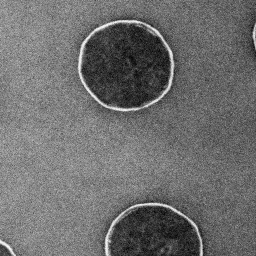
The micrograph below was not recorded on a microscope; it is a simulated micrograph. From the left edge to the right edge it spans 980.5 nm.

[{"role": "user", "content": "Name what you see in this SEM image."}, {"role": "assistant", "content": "raised bodies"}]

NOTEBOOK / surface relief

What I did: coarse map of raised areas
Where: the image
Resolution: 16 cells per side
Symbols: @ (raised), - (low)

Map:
----------------
-------@@-------
-----@@@@@------
-----@@@@@@-----
-----@@@@@@-----
-----@@@@@@-----
------@@@-------
----------------
----------------
----------------
----------------
----------------
----------------
-------@@@@@----
-------@@@@@----
@------@@@@@@---